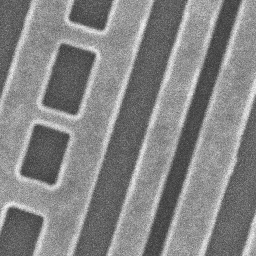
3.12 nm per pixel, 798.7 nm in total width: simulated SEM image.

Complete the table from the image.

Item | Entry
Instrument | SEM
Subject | one or a few lines or trenches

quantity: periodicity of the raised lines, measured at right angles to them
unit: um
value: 0.205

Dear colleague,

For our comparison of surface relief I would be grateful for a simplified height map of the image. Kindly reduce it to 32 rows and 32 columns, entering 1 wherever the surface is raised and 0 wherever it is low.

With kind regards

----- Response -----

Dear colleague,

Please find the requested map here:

00001111100000111110000011110011
00001111100000111110000111100011
00011111100000111100000111100011
00011111111001111100000111100111
00011111111111111100001111000111
00111110011111111000001111000111
00111110000011111000001111001111
00111110000011111000011110001111
01111100000011110000011110001111
01111100000111110000011110011111
01111100000111110000111100011111
01111000000111100000111100011111
11111000001111100000111100111111
11111100001111100001111000111110
11111111111111000001111000111110
11110111111111000001111000111110
11110000111111000011110001111100
11110000011111000011110001111100
11100000011110000011110001111100
11100000111110000111110011111000
11100000111110000111100011111000
11000000111100000111100011111000
11110001111100000111100111110000
11111111111100001111000111110000
11111111111000001111000111110000
11111111111000001111001111100000
10001111111000011110001111100000
00000011110000011110001111100000
00000111110000011110011111000000
00000111110000111100011111000001
00000111100000111100011111000001
00001111100000111100111110000001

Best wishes